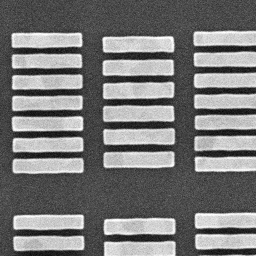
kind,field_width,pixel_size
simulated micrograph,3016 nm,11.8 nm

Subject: groups of lines, slits or small figures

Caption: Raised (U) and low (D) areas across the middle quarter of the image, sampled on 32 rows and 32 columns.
UUUUDDDDDDUUUUUUUUUUUUUUUUUDDDDD
DDDDDDDDDDUUUUUUUUUUUUUUUUUDDDDD
DDDDDDDDDDUUUUUUUUUUUUUUUUUDDDDD
UUUUDDDDDDDDDDDDDDDDDDDDDDDDDDDD
UUUUDDDDDDDDDDDDDDDDDDDDDDDDDDDD
UUUUDDDDDDUUUUUUUUUUUUUUUUUDDDDD
DDDDDDDDDDUUUUUUUUUUUUUUUUUDDDDD
DDDDDDDDDDUUUUUUUUUUUUUUUUUDDDDD
UUUUDDDDDDUUUDUUDDDDDDDDDDDDDDDD
UUUUDDDDDDDDDDDDDDDDDDDDDDDDDDDD
UUUUDDDDDDDDDDDDDDDDDDDDDDDDDDDD
DDDDDDDDDDUUUUUUUUUUUUUUUUUDDDDD
DDDDDDDDDDUUUUUUUUUUUUUUUUUDDDDD
UUUUDDDDDDUUUUUUUUUUUUUUUUUDDDDD
UUUUDDDDDDDDDDDDDDDDDDDDDDDDDDDD
UUUUDDDDDDDDDDDDDDDDDDDDDDDDDDDD
UUUUDDDDDDDDDDDDDDDDDDDDDUUDDDDD
DDDDDDDDDDUUUUUUUUUUUUUUUUUUDDDD
DDDUDDDDDDUUUUUUUUUUUUUUUUUUDDDD
UUUUDDDDDDUUUUUUUUUUUUUUUUUUDDDD
UUUUDDDDDDDDDDDDDDDDDDDDDDDDDDDD
UUUUDDDDDDDDDDDDDDDDDDDDDDDDDDDD
DDDDDDDDDDDUUUUUUUUUUUUUUUUDDDDD
DDDDDDDDDDUUUUUUUUUUUUUUUUUDDDDD
UUUUDDDDDDUUUUUUUUUUUUUUUUUDDDDD
UUUUDDDDDDUUUUUUUUUUUUUUUUDDDDDD
UUUUDDDDDDDDDDDDDDDDDDDDDDDDDDDD
DDDDDDDDDDDDDDDDDDDDDDDDDDDDDDDD
DDDDDDDDDDDDDDDDDDDDDDDDDDDDDDDD
DDDDDDDDDDDDDDDDDDDDDDDDDDDDDDDD
DDDDDDDDDDDDDDDDDDDDDDDDDDDDDDDD
DDDDDDDDDDDDDDDDDDDDDDDDDDDDDDDD